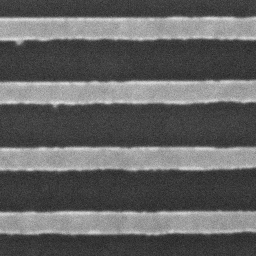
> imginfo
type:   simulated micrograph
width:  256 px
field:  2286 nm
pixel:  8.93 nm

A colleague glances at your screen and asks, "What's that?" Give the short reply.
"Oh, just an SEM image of lines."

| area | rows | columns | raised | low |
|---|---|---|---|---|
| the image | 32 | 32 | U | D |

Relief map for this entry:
DDDDDDDDDDDDDDDDDDDDDDDDDDDDDDDD
DDDDDDDDDDDDDDDDDDDDDDDDDDDDDDDD
UUUUUUUUUUUUUUUUUUUUUUUUUUUUUUUU
UUUUUUUUUUUUUUUUUUUUUUUUUUUUUUUU
UUUUUUUUUUUUUUUUUUUUUUUUUUUUUUUU
DDDDDDDDDDDDDDDDDDDDDDDDDDDDDDDD
DDDDDDDDDDDDDDDDDDDDDDDDDDDDDDDD
DDDDDDDDDDDDDDDDDDDDDDDDDDDDDDDD
DDDDDDDDDDDDDDDDDDDDDDDDDDDDDDDD
DDDDDDDDDDDDDDDDDDDDDDDDDDDDDDDD
UUUUUUUUUUUUUUUUUUUUUUUUUUUUUUUU
UUUUUUUUUUUUUUUUUUUUUUUUUUUUUUUU
UUUUUUUUUUUUUUUUUUUUUUUUUUUUUUUU
DDDDDDDDDDDDDDDDDDDDDDDDDDDDDDDD
DDDDDDDDDDDDDDDDDDDDDDDDDDDDDDDD
DDDDDDDDDDDDDDDDDDDDDDDDDDDDDDDD
DDDDDDDDDDDDDDDDDDDDDDDDDDDDDDDD
DDDDDDDDDDDDDDDDDDDDDDDDDDDDDDDD
DDDDDDDDDDDDDDDDDDDDDDDDDDDDDDDD
UUUUUUUUUUUUUUUUUUUUUUUUUUUUUUUU
UUUUUUUUUUUUUUUUUUUUUUUUUUUUUUUU
DDDDDDDDDDDDDDDDDDDDDDDDDDDDDDDD
DDDDDDDDDDDDDDDDDDDDDDDDDDDDDDDD
DDDDDDDDDDDDDDDDDDDDDDDDDDDDDDDD
DDDDDDDDDDDDDDDDDDDDDDDDDDDDDDDD
DDDDDDDDDDDDDDDDDDDDDDDDDDDDDDDD
DDDDDDDDDDDDDDDDDDDDDDDDDDDUDUDD
UUUUUUUUUUUUUUUUUUUUUUUUUUUUUUUU
UUUUUUUUUUUUUUUUUUUUUUUUUUUUUUUU
DDDDDDDDDDDDDDDDDDDDDDDDDDDDDDDD
DDDDDDDDDDDDDDDDDDDDDDDDDDDDDDDD
DDDDDDDDDDDDDDDDDDDDDDDDDDDDDDDD